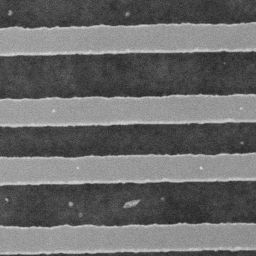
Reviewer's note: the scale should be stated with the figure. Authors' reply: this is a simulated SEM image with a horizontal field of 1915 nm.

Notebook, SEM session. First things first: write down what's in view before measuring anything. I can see lines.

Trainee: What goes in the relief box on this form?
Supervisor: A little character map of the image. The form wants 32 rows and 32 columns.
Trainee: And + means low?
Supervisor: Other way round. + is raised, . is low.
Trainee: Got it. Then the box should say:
................................
................................
................................
.++..+++++++++++++++++++++++++++
++++++++++++++++++++++++++++++++
++++++++++++++++++++++++++++++++
++++++++++++++++++++++++........
................................
................................
................................
................................
................................
++++++++++++++++++++++++++++++++
++++++++++++++++++++++++++++++++
++++++++++++++++++++++++++++++++
++++++++++++++++................
................................
................................
................................
...........+.+++++++++++++++++++
++++++++++++++++++++++++++++++++
++++++++++++++++++++++++++++++++
++++++++++++++++++++++++++++++++
................................
................................
................................
................................
................................
++++++++++++++++++++++++++++++++
++++++++++++++++++++++++++++++++
++++++++++++++++++++++++++++++++
++++++++++++++..................